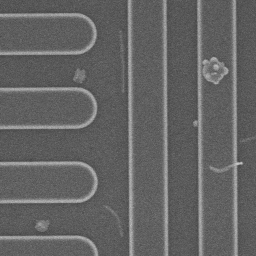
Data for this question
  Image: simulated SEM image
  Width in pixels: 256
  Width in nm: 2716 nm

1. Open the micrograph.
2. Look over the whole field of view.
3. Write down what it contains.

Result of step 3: groups of lines, slits or small figures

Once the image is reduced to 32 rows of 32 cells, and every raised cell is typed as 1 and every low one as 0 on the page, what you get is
00000000000000001111100001111000
00000000000000001111100001111000
11111111111000001111100001111000
11111111111100001111100001111000
11111111111100001111100001111000
11111111111100001111100001111000
11111111110000001111100001111000
00000000000000001111100001111000
00000000000000001111100001111000
00000000000000001111100001111000
00000000000000001111100001111000
11111111111000001111100001111000
11111111111100001111100001111000
11111111111100001111100001111000
11111111111100001111100001111000
11111111111000001111100001111000
00000000000000001111100001111000
00000000000000001111100001111000
00000000000000001111100001111000
00000000000000001111100001111000
11111111111000001111100001111100
11111111111100001111100001111000
11111111111100001111100001111000
11111111111100001111100001111000
11111111111000001111100001111000
00000000000000001111100001111000
00000000000000001111100001111000
00000000000000001111100001111000
00000000000000001111100001111000
00000000000000001111100001111000
11111111111100001111100001111000
11111111111100001111100001111000